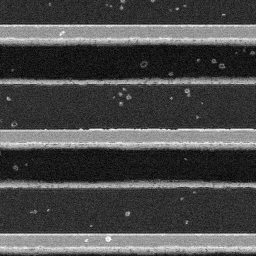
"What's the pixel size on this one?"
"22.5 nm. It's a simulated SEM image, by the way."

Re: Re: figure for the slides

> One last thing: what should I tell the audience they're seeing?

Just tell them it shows lines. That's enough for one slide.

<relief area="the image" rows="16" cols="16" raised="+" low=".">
++++++++++++++++
++++++++++++++++
++++++++++++++++
................
................
++++++++++++++++
++++++++++++++++
++++++++++++++++
++++++++++++++++
................
................
................
++++++++++++++++
++++++++++++++++
++++++++++++++++
++++++++++++++++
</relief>